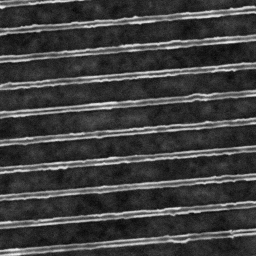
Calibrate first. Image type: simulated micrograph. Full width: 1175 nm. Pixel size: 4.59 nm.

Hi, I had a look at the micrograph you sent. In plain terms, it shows parallel lines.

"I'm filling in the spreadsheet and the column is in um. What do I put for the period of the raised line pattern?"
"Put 0.127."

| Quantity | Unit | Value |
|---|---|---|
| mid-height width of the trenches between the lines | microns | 0.0984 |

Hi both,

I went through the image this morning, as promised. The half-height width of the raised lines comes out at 29.7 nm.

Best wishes